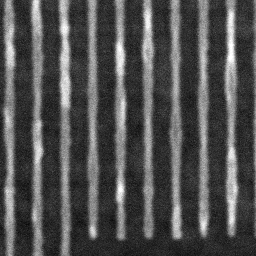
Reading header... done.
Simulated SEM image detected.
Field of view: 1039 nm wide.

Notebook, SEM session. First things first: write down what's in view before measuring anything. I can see parallel lines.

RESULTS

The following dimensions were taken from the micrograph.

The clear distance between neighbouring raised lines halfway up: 87.8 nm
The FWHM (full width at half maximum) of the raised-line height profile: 23.8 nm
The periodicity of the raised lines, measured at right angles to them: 113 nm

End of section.